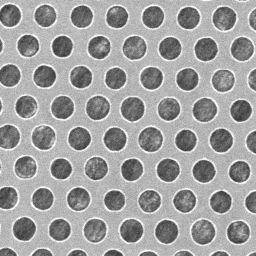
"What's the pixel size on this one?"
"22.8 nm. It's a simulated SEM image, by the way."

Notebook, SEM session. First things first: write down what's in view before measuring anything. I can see a regular array of holes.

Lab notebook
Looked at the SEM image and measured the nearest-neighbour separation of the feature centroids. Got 794 nm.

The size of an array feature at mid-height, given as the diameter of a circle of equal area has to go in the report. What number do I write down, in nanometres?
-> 535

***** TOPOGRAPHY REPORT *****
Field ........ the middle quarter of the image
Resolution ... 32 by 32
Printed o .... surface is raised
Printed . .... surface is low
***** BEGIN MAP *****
ooo..ooooooooooooooooooooooooooo
oo....ooooo....ooooo....ooooo...
o......ooo......ooo......ooo....
o......ooo......ooo......ooo....
oo.....ooo.....oooo......ooo....
oo....ooooo....ooooo....ooooo...
oooooooooooo.ooooooooo.ooooooo..
oooooooooooooooooooooooooooooooo
.oooooo....ooooo...ooooooo.ooooo
..oooo.....ooo......oooo.....ooo
...oo.......oo......ooo......ooo
...oo.......oo......ooo......ooo
..oooo.....ooo......oooo.....ooo
.oooooo...ooooo....ooooo....oooo
ooooooooooooooooo.oooooooooooooo
oooooooooooooooooooooooooooooooo
oo....ooooo....ooooo....oooooo.o
o.....oooo.....oooo.....oooo....
o......ooo......oo.......ooo....
o......ooo......oo.......ooo....
oo....oooo.....oooo.....oooo....
ooo..oooooo...oooooo...oooooo...
oooooooooooooooooooooooooooooooo
ooooooo..oooooooo.oooooooooooooo
.ooooo.....oooo....ooooo....oooo
..ooo......ooo......ooo......ooo
..ooo......ooo......ooo......ooo
..ooo......ooo......ooo......ooo
.ooooo....ooooo....ooooo....oooo
ooooooooooooooooooooooooo..ooooo
oooooooooooooooooooooooooooooooo
oo....oooooooooooooo..oooooooo..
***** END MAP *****